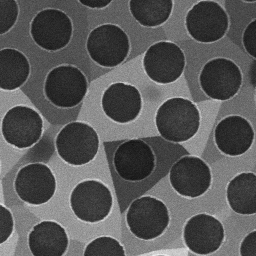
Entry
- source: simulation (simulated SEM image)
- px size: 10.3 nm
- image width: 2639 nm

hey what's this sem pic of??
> a regular array of holes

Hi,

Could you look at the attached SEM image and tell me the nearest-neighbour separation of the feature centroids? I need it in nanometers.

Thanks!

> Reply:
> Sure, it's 602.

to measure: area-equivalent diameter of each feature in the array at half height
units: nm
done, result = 432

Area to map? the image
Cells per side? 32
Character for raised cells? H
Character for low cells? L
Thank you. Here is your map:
LLHHHHHHHHLLLLHHLLLLLLHHHLLHHHHH
LLHHHLLLHHHHHHHHLLLLLHHHLLLLHHHH
LLHHLLLLLHHHHHHHHLLLLHHLLLLLLHHH
LHHHLLLLLHHHLLLHHHHHHHHLLLLLHHHL
HHHHLLLLLHHLLLLLHHHHHHHHLLLLHHLL
HHHHHLLLHHHLLLLLHHHLLLHHHHHHHHLL
LLLHHHHHHHHLLLLLHHLLLLLHHHHHHHHL
LLLHHHHHHHHHLLLHHHLLLLLHHHLLLHHH
LLLLHHHLLHHHHHHHHHLLLLLHHLLLLLHH
LLLLHHLLLLLHHHHHHHHLLLLHHLLLLLHH
LLLHHHLLLLLHHHLLHHHHHHHHHLLLLLHH
HHHHHHLLLLLHHLLLLHHHHHHHHHLLLLHH
HHHHHHLLLLHHHLLLLLHHHLLHHHHLHHHH
HHLLHHHHHHHHHLLLLLHHLLLLLHHHHHHH
HLLLLHHHHHHHHLLLLHHHLLLLLHHHHLHH
LLLLLHHHHLLHHHHHHHHHLLLLLHHLLLLH
LLLLLHHLLLLLHHHHHHHHLLLLLHHLLLLL
HLLLLHHLLLLLHHHHHHHHHLLHHHHLLLLL
HHHHHHHLLLLLHHHLLLLHHHHHHHHLLLLH
HHHHHHHLLLLLHHLLLLLHHHHHHHHHHHHH
HHHHLHHHHLLHHHLLLLLHHHLLLLHHHHHH
HHLLLLHHHHHHHHHLLLLHHLLLLLHHHHHH
HHLLLLLHHHHHHHHHLLHHHLLLLLHHHLLL
HHLLLLLHHLLLLHHHHHHHHHLLLLHHLLLL
HHLLLLLHHLLLLLHHHHHHHHHLLHHHLLLL
HHHHLHHHHLLLLLHHLLLLLHHHHHHHHLLL
LHHHHHHHHLLLLLHHLLLLLHHHHHHHHHLL
LLHHHHHHHHLLLHHHLLLLLHHHLLLHHHHH
LLHHLLLLHHHHHHHHLLLLLHHLLLLLHHHH
LHHHLLLLHHHHHHHHHLLLHHHLLLLLHHHL
HHHHLLLLLHHLLLLHHHHHHHHLLLLLHHLL
HHHHLLLLHHHLLLLLHHHHHHHHLLLHHHLL